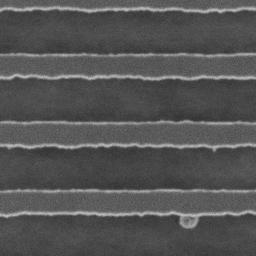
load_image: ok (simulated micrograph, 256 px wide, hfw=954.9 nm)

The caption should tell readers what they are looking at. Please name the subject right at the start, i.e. lines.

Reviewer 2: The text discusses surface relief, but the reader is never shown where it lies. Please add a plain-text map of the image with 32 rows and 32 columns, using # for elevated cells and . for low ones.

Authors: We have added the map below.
################################
.........................#.#....
................................
................................
................................
................................
................................
################################
################################
################################
................................
................................
................................
................................
................................
################################
################################
################################
........#.......................
................................
................................
................................
................................
................................
################################
################################
################################
................................
................................
................................
................................
................................